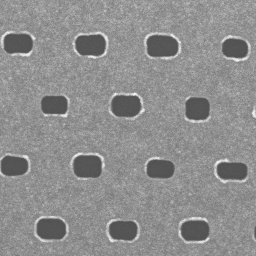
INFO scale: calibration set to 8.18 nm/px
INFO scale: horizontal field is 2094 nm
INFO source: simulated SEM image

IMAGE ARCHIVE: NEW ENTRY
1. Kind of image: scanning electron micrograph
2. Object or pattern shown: a regular array of holes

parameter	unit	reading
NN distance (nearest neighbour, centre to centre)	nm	574